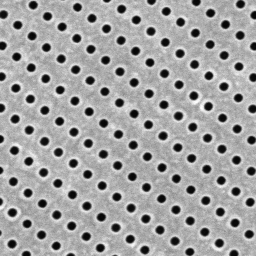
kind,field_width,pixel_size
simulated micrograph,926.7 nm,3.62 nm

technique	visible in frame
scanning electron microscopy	a regular array of holes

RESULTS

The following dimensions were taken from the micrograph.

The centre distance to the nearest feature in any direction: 65.6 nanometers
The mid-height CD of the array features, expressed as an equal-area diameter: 32.2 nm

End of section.